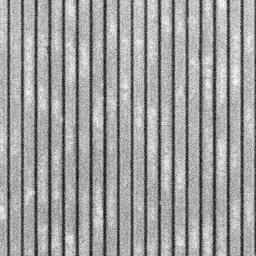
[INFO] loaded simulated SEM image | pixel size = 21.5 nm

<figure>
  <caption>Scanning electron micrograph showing parallel lines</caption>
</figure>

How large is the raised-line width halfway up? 193 nm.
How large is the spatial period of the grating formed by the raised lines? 295 nm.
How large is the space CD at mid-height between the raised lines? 85.9 nanometres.